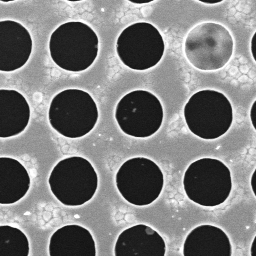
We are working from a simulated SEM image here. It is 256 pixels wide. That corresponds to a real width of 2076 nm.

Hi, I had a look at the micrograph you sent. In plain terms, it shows a regular array of holes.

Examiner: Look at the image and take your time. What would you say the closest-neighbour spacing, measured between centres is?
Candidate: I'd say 539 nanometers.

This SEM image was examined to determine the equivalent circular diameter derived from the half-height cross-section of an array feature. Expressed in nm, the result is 390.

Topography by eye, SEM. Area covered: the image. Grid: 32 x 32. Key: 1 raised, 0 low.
11111111111111111111111111111111
11111111111111111111111111111111
11111111111111111111111111111111
00011110000111110001111111011111
00001100000011100000111100011111
00001100000011100000111000001110
00001100000011100000111100011110
00011110000011100000111111111111
00111111000111110001111111111111
11111111111111111111111111111111
11111111111111111111111111111111
00111111000111111011111110011111
00011110000011100000111100000111
00001100000011100000111000000110
00001100000011100000111000000110
00011100000011100000111000000111
00011110000111110001111100001111
11111111111111111111111111111111
11111111111111111111111111111111
11111111111111111111111111111111
00011110000111100001111100001111
00011110000011100000111000000111
00001100000011000000111000000110
00001100000011100000111000000110
00011110000011100000111100001111
11111111001111111001111110011111
11111111111111111111111111111111
11111111111111111111111111111111
00111111001111110001111100011111
00011100000111100000111000001111
00001100000011000000011000000110
00001100000011000000011000000110